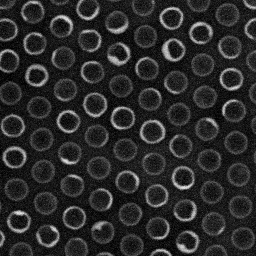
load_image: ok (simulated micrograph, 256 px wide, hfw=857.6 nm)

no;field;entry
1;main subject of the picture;a regular array of raised bodies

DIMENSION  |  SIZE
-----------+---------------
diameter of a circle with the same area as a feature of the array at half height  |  76.3 nanometres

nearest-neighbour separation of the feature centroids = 106 nanometres